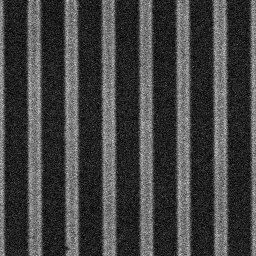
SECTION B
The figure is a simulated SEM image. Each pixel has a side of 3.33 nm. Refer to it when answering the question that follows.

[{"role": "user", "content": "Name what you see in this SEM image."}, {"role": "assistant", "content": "parallel lines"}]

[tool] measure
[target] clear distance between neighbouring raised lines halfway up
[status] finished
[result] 87.9 nm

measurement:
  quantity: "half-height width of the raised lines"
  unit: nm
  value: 34.2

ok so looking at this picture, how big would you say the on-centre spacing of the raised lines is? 124 nm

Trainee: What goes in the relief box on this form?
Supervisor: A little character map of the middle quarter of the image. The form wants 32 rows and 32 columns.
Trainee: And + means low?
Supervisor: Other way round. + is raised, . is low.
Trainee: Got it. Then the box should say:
.++.......++.......+++.......++.
.++.......++.......+++.......++.
.++.......++.......+++.......++.
.++.......++.......+++.......++.
.++.......++.......+++.......++.
.++.......++.......+++.......++.
.++.......++.......+++.......++.
.++.......++.......+++.......++.
.++.......++.......+++.......++.
.++.......++.......+++.......++.
.++.......++.......+++.......++.
.++.......++.......+++.......++.
.++.......++.......+++.......++.
.++.......++.......+++.......++.
.++.......++.......+++.......++.
.++.......++.......+++.......++.
.++.......++.......+++.......++.
.++.......++.......+++.......++.
.++.......++.......+++.......++.
.++.......++.......+++.......++.
.++.......++.......+++.......++.
.++.......++.......+++.......++.
.++.......++.......+++.......++.
.++.......++.......+++.......++.
.++.......++.......+++.......++.
.++.......++.......+++.......++.
.++.......++.......+++.......++.
.++.......++.......+++.......++.
.++.......++.......+++.......++.
.++.......++.......+++.......++.
.++.......++.......+++.......++.
.++.......++.......+++.......++.